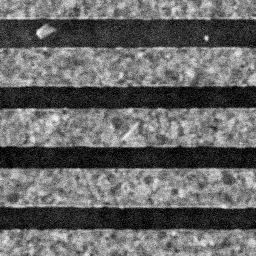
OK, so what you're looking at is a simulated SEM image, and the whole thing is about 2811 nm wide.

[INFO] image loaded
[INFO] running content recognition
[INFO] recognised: lines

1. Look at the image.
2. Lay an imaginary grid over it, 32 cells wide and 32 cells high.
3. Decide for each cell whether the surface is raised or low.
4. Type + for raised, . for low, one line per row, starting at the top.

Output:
++++++++++++++++++++++++++++++++
++++++++++++++++++++++++++++++++
................................
................................
................................
................................
++++++++++++++++++++++++++++++++
++++++++++++++++++++++++++++++++
++++++++++++++++++++++++++++++++
++++++++++++++++++++++++++++++++
++++++++++++++++++++++++++++++++
................................
................................
................................
++++++++++++++++++++++++++++++++
++++++++++++++++++++++++++++++++
++++++++++++++++++++++++++++++++
++++++++++++++++++++++++++++++++
................................
................................
................................
++++++++++++++++++++++++++++++++
++++++++++++++++++++++++++++++++
++++++++++++++++++++++++++++++++
++++++++++++++++++++++++++++++++
++++++++++++++++++++++++++++++++
................................
................................
................................
++++++++++++++++++++++++++++++++
++++++++++++++++++++++++++++++++
++++++++++++++++++++++++++++++++